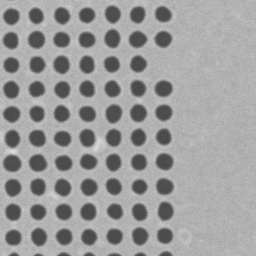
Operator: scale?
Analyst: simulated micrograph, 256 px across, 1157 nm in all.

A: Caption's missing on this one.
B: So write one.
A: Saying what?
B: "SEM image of a regular array of holes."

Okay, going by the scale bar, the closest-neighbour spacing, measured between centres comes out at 109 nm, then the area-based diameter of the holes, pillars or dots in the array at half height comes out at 16.5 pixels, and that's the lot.